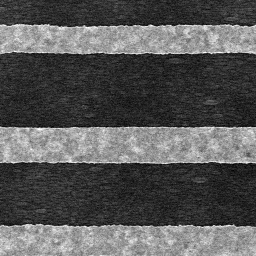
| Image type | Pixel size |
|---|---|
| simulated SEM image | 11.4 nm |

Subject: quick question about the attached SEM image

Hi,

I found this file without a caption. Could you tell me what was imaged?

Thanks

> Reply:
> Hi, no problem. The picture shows one or a few lines or trenches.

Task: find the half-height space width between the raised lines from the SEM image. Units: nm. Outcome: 744